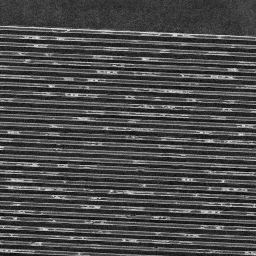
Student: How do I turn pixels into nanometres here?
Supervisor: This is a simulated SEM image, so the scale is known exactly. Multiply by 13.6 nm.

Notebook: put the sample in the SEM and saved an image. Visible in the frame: parallel lines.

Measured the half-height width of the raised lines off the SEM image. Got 52.8 nanometers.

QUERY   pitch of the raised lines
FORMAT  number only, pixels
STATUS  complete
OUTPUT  7.94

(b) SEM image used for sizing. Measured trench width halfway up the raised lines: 4.87 pixels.